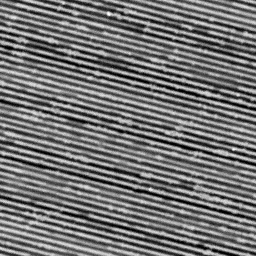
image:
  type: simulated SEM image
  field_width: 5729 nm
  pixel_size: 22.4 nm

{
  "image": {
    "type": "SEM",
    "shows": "parallel lines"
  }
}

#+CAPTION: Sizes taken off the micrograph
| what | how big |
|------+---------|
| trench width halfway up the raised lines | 0.0868 um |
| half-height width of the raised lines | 0.0651 micrometres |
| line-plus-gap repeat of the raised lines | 150 nm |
